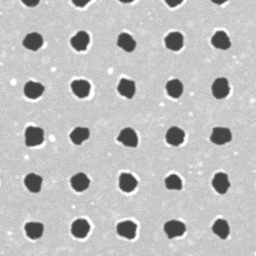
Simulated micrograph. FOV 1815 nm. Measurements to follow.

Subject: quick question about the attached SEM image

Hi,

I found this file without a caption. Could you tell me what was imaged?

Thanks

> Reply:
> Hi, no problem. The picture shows a regular array of holes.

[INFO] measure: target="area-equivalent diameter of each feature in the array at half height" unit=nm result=141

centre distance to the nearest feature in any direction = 326 nm